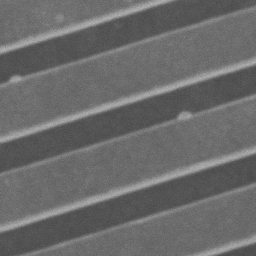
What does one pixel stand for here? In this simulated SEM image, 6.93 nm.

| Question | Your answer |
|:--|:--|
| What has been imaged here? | lines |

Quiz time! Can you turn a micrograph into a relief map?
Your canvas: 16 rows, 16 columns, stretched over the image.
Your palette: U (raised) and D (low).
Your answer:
UUUUUUUUUDDDDDDD
UUUUUUDDDDDDUUUU
UUUDDDDDDUUUUUUU
DDDDDDUUUUUUUUUU
DDDUUUUUUUUUUUDD
UUUUUUUUUUUDDDDD
UUUUUUUUDDDDDDUU
UUUUUDDDDDDUUUUU
UDDDDDDDUUUUUUUU
DDDDUUUUUUUUUUUU
DUUUUUUUUUUUUDDD
UUUUUUUUUUDDDDDD
UUUUUUUDDDDDDUUU
UUUDDDDDDUUUUUUU
DDDDDDUUUUUUUUUU
DDDUUUUUUUUUUUUD